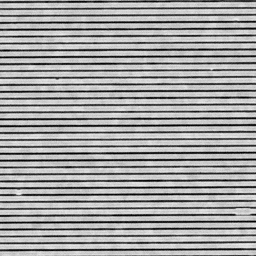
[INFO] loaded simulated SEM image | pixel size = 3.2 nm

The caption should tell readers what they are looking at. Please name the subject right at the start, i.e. parallel lines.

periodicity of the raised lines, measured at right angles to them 6.91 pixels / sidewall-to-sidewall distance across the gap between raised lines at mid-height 0.008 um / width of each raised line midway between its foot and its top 13.6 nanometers